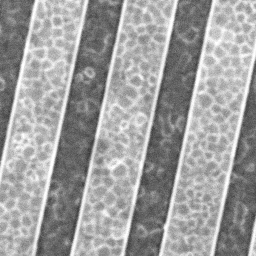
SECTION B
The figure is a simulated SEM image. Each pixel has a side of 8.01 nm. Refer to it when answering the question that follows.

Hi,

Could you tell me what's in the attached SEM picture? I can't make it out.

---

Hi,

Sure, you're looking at one or a few lines or trenches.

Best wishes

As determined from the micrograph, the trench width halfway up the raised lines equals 301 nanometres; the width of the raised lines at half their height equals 0.401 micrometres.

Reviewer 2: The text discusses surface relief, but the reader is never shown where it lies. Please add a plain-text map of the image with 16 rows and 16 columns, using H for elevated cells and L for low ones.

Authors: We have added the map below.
LLHHHLLLHHHLLHHH
LLHHHLLLHHHLLHHH
LLHHHLLHHHLLLHHH
LLHHHLLHHHLLLHHH
LHHHLLLHHHLLHHHH
LHHHLLLHHHLLHHHL
LHHHLLHHHHLLHHHL
LHHHLLHHHLLLHHHL
LHHHLLHHHLLLHHHL
HHHLLLHHHLLHHHHL
HHHLLLHHHLLHHHLL
HHHLLHHHHLLHHHLL
HHHLLHHHLLLHHHLL
HHHLLHHHLLLHHHLL
HHLLLHHHLLHHHHLL
HHLLLHHHLLHHHLLL